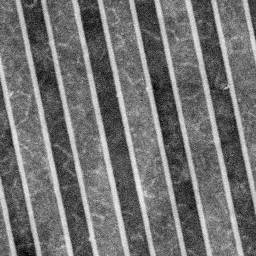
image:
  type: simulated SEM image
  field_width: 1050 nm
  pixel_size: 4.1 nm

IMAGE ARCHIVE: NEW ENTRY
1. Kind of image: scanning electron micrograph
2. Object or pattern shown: parallel lines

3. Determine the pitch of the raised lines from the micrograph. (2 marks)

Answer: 0.228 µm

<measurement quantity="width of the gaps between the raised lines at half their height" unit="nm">104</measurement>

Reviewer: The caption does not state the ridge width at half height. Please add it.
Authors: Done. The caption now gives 30.1 px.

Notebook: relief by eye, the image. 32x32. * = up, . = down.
**...****....****...****...****.
***...****...****...****...****.
***...****...****...****...****.
***...****...****...****...****.
***...****...****...*****...***.
***...*****...****...****...****
****...****...****...****...****
****...****...****...****...****
****...****...****...****...****
****...****....***...*****...***
****....****...****...****...***
.****...****...****...****...***
.****...****...****...****...***
.****...****...****...****...***
.****...****...****....****...**
.****....****...****...****...**
..****...****...****...****...**
..****...****...****...****...**
..****...****...****...****...**
..****...****...****....****...*
..*****...****...****...****...*
...****...****...****...****...*
...****...****...****...****...*
...****...****...****...****...*
...****...****....***....****...
....****...****...****...****...
*...****...****...****...****...
*...****...****...****...****...
*...****...****...****...****...
*...****...****....***....****..
**...****...****...****...****..
**...****...****...****...****..